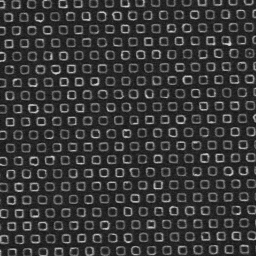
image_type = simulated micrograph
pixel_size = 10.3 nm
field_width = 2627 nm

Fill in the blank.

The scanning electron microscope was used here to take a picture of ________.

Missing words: a regular array of raised bodies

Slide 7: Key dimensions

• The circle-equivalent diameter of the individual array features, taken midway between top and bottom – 97.6 nanometers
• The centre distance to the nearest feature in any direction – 153 nm